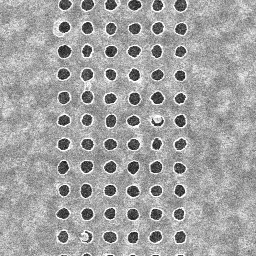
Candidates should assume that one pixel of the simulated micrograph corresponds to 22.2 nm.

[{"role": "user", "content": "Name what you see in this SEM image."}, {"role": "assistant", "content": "a regular array of holes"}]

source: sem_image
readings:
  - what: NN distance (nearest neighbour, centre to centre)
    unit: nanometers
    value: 502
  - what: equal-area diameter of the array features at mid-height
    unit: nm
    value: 270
